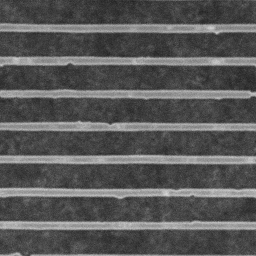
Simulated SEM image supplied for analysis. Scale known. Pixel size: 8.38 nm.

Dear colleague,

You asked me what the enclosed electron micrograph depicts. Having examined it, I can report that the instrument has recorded parallel lines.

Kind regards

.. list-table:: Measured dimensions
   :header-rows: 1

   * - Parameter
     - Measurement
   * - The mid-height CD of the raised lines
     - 60.7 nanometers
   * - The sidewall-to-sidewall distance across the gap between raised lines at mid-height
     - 214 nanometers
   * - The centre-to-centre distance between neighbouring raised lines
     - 276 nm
